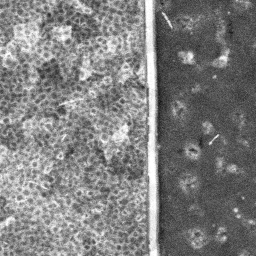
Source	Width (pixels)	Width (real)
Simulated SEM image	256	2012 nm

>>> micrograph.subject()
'one or a few lines or trenches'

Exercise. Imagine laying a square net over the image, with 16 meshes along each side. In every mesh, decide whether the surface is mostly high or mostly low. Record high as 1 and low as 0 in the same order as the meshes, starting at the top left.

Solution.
1111111110000000
1111111110000000
1111111110000000
1111111110000000
1111111110000000
1111111110000000
1111111111000000
1111111111000000
1111111110000000
1111111110000000
1111111110000000
1111111111000000
1111111111000000
1111111111000000
1111111111000000
1111111111000000